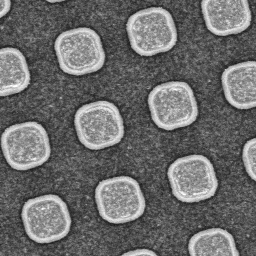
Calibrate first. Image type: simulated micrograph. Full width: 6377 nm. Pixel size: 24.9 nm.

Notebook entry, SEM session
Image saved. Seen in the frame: a regular array of raised bodies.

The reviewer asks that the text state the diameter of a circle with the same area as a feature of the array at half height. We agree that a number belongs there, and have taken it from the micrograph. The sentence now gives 1120 nanometres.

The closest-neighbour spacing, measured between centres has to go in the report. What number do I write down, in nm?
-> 1890